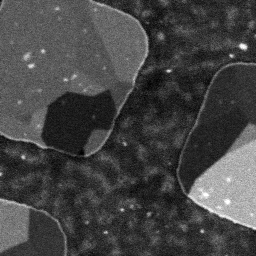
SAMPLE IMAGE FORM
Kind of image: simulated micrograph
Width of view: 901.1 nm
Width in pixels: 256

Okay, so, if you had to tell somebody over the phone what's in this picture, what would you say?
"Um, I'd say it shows raised bodies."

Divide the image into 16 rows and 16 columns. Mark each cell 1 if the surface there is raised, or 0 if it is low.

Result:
1111111000000000
1111111110000000
1111111110000000
1111111110000000
1111111110000011
1111111100000111
1111111100000111
1111111000001111
1111111000001111
0000110000011111
0000000000011111
0000000000011111
0000000000001111
1110000000000011
1111000000000000
1111000000000000